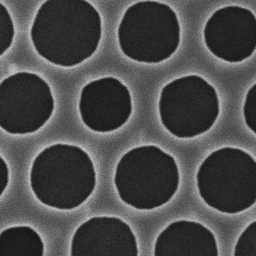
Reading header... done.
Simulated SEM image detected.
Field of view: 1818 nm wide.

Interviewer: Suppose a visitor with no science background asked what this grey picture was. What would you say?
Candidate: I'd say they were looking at holes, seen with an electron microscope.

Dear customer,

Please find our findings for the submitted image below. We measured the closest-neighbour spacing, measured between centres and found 592 nm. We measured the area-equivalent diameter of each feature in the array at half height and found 0.445 microns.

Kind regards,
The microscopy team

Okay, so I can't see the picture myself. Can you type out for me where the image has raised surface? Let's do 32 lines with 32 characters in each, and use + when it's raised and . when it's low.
+++++......++++++...++++++++++++
.++++.......++++......+++++....+
..++.........++.......++++......
..++.........++.......++++......
..++.........++.......++++......
.+++........+++.......++++......
.++++.......+++.......++++......
++++++.....++++++....+++++++..++
++++++++++++++++++++++++++++++++
+....++++++++++++++++++..+++++++
......+++++....++++++.....++++++
......++++......++++.......++++.
.......+++......++++.......++++.
.......+++......++++.......+++..
......++++......++++.......+++..
......+++++....+++++.......++++.
+...++++++++.++++++++.....++++++
++++++++++++++++++++++++++++++++
++++++....+++++++...++++++++.+++
+++++......++++......+++++.....+
.+++........+++.......+++.......
.+++........+++.......+++.......
.+++........++........+++.......
.+++........+++.......+++.......
+++++......++++.......+++.......
++++++....++++++.....+++++......
++++++++++++++++++++++++++++..++
+++++++++++....+++++++++++++++++
+...++++++......+++++.....+++++.
.....++++........+++.......+++..
.....++++........++........+++..
.....++++........++........++...